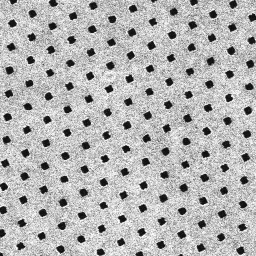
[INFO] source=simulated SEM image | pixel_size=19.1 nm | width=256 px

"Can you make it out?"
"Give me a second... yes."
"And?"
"a regular array of holes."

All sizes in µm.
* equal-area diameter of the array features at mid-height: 0.156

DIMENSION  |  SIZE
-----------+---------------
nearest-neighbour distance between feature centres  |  22.8 pixels